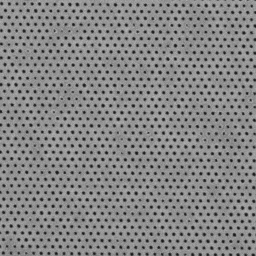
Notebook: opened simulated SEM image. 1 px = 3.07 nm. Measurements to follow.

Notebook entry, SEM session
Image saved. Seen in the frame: a regular array of holes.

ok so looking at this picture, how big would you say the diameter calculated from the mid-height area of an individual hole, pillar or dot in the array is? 8.5 nm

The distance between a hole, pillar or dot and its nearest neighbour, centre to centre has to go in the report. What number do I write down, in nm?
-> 22.7